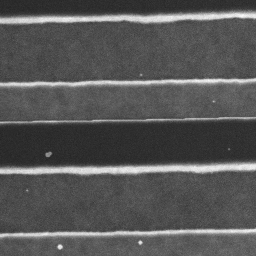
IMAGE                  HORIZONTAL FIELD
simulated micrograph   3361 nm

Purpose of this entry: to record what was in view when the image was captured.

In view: lines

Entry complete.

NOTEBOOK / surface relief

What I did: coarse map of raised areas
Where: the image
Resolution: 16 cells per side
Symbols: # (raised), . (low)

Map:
################
................
................
................
................
################
################
################
################
################
########........
................
................
................
.............###
################